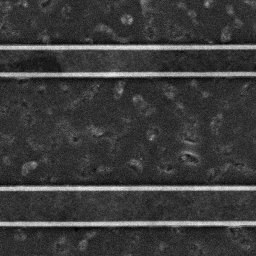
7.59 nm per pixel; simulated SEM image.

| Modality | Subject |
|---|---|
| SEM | one or a few lines or trenches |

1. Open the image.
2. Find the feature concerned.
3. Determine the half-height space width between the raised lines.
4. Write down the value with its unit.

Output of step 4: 861 nm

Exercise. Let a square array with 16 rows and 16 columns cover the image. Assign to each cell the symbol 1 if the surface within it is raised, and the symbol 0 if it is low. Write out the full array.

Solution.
0000000000000000
0000000000000000
0000000000000000
1111111111111111
1111111111111111
0000000000000000
0000000000000000
0000000000000000
0000000000000000
0000000000000000
0000000000000000
0000000000000000
1111111111111111
1111111111111111
0000000000000000
0000000000000000